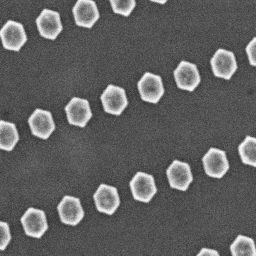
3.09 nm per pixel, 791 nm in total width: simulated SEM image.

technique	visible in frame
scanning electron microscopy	a regular array of raised bodies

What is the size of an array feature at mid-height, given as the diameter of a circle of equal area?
80.2 nm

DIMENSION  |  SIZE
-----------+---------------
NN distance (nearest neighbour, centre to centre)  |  118 nanometres